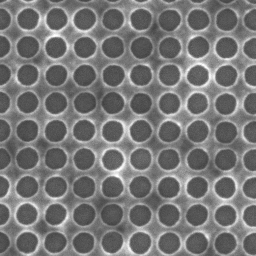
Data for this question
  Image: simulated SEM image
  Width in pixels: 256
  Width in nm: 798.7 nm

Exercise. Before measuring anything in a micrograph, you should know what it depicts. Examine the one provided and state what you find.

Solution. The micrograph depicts a regular array of holes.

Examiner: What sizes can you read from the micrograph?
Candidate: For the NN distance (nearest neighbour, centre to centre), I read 86.4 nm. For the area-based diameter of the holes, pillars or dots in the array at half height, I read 69.5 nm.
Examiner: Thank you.